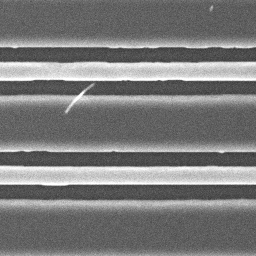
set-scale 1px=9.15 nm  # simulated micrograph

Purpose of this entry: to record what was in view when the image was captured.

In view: lines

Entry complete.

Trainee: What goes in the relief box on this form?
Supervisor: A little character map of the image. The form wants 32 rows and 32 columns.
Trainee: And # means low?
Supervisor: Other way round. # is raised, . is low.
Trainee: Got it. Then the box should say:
################################
################################
################################
################################
################################
################################
................................
................................
################################
################################
................................
................................
################################
################################
################################
################################
################################
################################
################################
................................
................................
################################
################################
................................
................................
################################
################################
################################
################################
################################
################################
################################